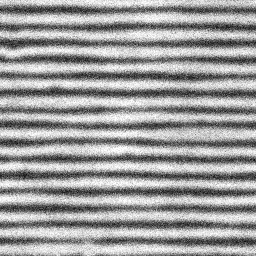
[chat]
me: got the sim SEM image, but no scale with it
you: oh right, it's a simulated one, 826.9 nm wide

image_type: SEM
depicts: parallel lines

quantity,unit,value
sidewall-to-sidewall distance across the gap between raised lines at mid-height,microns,0.0287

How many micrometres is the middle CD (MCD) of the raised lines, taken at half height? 0.0258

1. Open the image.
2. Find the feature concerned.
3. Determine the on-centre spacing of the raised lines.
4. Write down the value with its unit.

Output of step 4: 53.3 nm